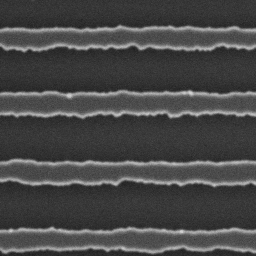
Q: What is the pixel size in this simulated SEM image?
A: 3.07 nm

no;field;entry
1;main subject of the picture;lines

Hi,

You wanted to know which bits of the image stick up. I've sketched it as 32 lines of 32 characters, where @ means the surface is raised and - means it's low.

--------------------------------
--------------------------------
--------------------------------
-------------@@@--@@@@@@@---@@--
@@@@@@@@@@@@@@@@@@@@@@@@@@@@@@@@
@@@@@@@@@@@@@@@@@@@@@@@@@@@@@@@@
--------------------------------
--------------------------------
--------------------------------
--------------------------------
--------------------------------
-----@@-------@@@-----@@-------@
@@@@@@@@@@@@@@@@@@@@@@@@@@@@@@@@
@@@@@@@@@@@@@@@@@@@@@@@@@@@@@@@@
-----@----@----------@----------
--------------------------------
--------------------------------
--------------------------------
--------------------------------
--------------------------------
@@@@@@@@@@@@@@@@@@@@@@@@@@@@@@@@
@@@@@@@@@@@@@@@@@@@@@@@@@@@@@@@@
@-@@@@@@@@@@@@@-@@@@@@@@@@@@@@@@
--------------------------------
--------------------------------
--------------------------------
--------------------------------
--------------------------------
----------------@---------------
@@@@@@@@@@@@@@@@@@@@@@@@@@@@@@@@
@@@@@@@@@@@@@@@@@@@@@@@@@@@@@@@@
@-----------------@@-----------@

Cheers